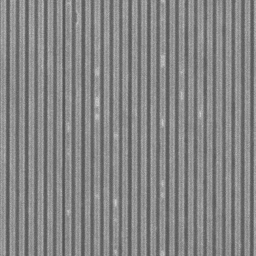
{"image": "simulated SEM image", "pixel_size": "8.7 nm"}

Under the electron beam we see parallel lines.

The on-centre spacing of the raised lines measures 81.7 nanometres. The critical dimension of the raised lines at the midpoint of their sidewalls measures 43.5 nanometres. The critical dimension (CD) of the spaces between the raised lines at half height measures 42.4 nanometers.